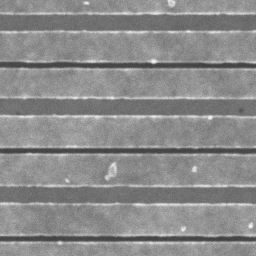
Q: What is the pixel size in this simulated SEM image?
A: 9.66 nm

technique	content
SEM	lines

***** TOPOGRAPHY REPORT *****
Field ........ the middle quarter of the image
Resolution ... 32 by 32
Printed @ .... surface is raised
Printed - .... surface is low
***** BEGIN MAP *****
--------------------------------
@@@@@@@@@@@@@@@@@@@@@@@@@@@@@@@@
@@@@@@@@@@@@@@@@@@@@@@@@@@@@@@@@
@@@@@@@@@@@@@@@@@@@@@@@@@@@@@@@@
@@@@@@@@@@@@@@@@@@@@@@@@@@@@@@@@
@@@@@@@@@@@@@@@@@@@@@@@@@@@@@@@@
@@@@@@@@@@@@@@@@@@@@@@@@@@@@@@@@
@@@@@@@@@@@@@@@@@@@@@@@@@@@@@@@@
@-@@-@--@@@@@@-@@@@@@@@@@@@@@@@@
--------------------------------
--------------------------------
--------------------------------
--------------------------------
@@@@@@@@@@@@@@@@@@@@@@@@@@@@@@@@
@@@@@@@@@@@@@@@@@@@@@@@@@@@@@@@@
@@@@@@@@@@@@@@@@@@@@@@@@@@@@@@@@
@@@@@@@@@@@@@@@@@@@@@@@@@@@@@@@@
@@@@@@@@@@@@@@@@@@@@@@@@@@@@@@@@
@@@@@@@@@@@@@@@@@@@@@@@@@@@@@@@@
@@@@@@@@@@@@@@@@@@@@@@@@@@@@@@@@
@@@@@@@@@@@@@@@@@@@@@@@@@@@@@@@@
--------------------------------
--------------------@@----------
@@@@@@@@@@@@@@@@@@@@@@@@@@@@@@@@
@@@@@@@@@@@@@@@@@@@@@@@@@@@@@@@@
@@@@@@@@@@@@@@@@@@@@@@@@@@@@@@@@
@@@@@@@@@@@@@@@@@@@@@@@@@@@@@@@@
@@@@@@@@@@@@@@@@@@@@@@@@@@@@@@@@
@@@@@@@@@@@@@@@@@@@@@@@@@@@@@@@@
@@@@@@@@@@@@@@@@@@@@@@@@@@@@@@@@
@@@@--@@@@@@@---@@@@@@@@@@@@@@@@
--------------------------------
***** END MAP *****